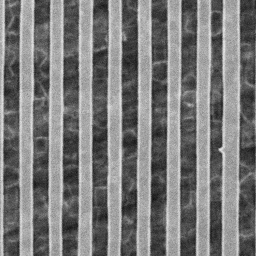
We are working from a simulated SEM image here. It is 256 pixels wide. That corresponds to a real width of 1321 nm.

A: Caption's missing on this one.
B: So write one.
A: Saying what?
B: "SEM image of parallel lines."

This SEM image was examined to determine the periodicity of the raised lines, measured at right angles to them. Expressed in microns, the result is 0.151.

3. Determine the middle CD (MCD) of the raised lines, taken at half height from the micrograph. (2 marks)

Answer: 12.2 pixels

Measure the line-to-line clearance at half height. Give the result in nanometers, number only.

92.9